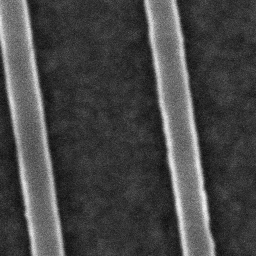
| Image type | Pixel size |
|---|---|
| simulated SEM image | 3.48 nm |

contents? one or a few lines or trenches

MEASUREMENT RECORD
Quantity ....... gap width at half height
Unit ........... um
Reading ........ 0.415